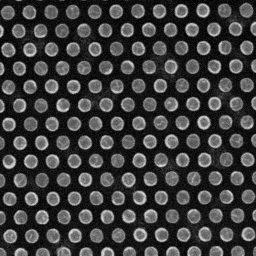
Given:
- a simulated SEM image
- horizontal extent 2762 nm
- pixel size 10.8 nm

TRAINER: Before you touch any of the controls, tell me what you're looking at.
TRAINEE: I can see a regular array of raised bodies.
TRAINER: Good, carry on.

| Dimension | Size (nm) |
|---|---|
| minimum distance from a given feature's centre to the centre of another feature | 230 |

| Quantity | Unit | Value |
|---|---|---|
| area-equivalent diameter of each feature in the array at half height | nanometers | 142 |